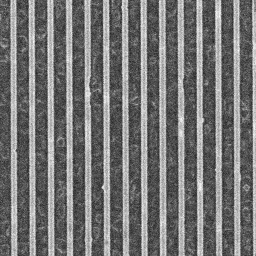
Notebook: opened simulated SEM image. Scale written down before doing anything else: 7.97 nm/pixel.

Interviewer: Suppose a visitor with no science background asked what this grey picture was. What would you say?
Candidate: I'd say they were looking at parallel lines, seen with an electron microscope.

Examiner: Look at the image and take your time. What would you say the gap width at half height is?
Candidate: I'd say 0.103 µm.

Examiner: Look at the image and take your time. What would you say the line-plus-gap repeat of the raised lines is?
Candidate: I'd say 18.6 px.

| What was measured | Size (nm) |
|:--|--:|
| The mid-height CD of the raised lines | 43.8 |